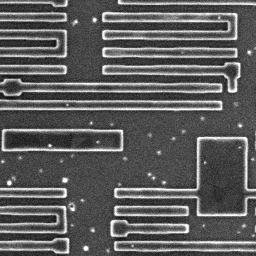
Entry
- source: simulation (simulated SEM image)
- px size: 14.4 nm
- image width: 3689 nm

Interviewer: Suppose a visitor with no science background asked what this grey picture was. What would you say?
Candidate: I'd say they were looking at wiring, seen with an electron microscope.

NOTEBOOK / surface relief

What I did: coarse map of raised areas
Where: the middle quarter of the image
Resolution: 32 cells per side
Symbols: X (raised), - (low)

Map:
----------XXXXXX------XXXXXXXXXX
----------XXXXXXXXXXXXXXXXXXXXXX
------------------------XXXXXXXX
--------------------------------
--------------------------------
XXXXXXXXXXXXXXXXXXXXXXXXXXXXXXXX
XXXXXXXXXXXXXXXXXXXXXXXXXXXXXXXX
--------------------------------
--------------------------------
XXXXXXXXXXXXXXXXXXXXXXXXXXXXXXXX
XXXXXXXXXXXXXXXXXXXXXXXXXXXXXXXX
---------------------------XX---
--------------------------------
--------------------------------
--------------------------------
--------------------------------
XXXXXXXX------------------------
XXXXXXXXXXXXXXX-----------------
XXXXXXXXXXXXXXX-----------------
XXXXXXXXXXXXXXX-----------------
XXXXXXXXXXXXXXX-----------------
XXXXXXXXXXXXXX------------------
--------------------------------
--------------------------------
--------------------------------
--------------------------------
--------------------------------
--------------------------------
--------------------------------
--------------------------------
--------------------------------
-------------XXXXXXXXXXXXXXXXXXX